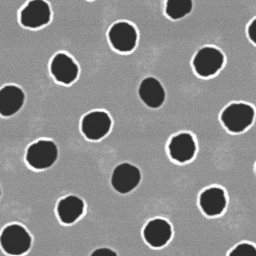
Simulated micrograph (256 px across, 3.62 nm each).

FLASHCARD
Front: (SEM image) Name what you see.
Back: a regular array of holes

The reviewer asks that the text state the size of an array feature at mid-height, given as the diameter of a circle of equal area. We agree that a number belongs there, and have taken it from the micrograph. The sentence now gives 0.102 micrometres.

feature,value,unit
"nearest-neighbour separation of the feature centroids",225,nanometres